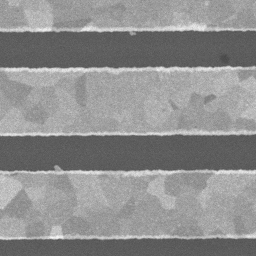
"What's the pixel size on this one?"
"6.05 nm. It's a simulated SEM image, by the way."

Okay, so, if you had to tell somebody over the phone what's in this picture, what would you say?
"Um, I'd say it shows lines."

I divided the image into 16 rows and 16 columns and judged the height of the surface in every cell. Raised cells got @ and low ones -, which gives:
@@@@@@@@@@@@@@@@
@@@@@@@@@@@@@@@@
----------------
----------------
@@@@@@@@@@@@@@@@
@@@@@@@@@@@@@@@@
@@@@@@@@@@@@@@@@
@@@@@@@@@@@@@@@@
----------------
----------------
----------------
@@@@@@@@@@@@@@@@
@@@@@@@@@@@@@@@@
@@@@@@@@@@@@@@@@
@@@@@@@@@@@@@@@@
----------------